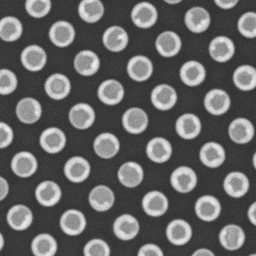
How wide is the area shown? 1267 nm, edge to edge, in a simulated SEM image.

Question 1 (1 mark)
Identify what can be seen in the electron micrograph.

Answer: a regular array of raised bodies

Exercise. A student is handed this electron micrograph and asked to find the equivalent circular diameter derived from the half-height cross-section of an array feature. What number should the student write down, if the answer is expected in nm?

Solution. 120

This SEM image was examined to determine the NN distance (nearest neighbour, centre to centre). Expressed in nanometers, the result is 185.